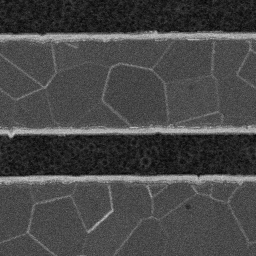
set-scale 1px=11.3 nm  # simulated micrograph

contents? one or a few lines or trenches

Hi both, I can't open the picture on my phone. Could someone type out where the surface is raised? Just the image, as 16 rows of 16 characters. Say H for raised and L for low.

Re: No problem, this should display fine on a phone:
LLLLLLLLLLLLLLLL
LLLLLLLLLLLLLLLL
HHHHHHHHHHHHHHHH
HHHHHHHHHHHHHHHH
HHHHHHHHHHHHHHHH
HHHHHHHHHHHHHHHH
HHHHHHHHHHHHHHHH
HHHHHHHHHHHHHHHH
LLLLLLLLLLLLLLLL
LLLLLLLLLLLLLLLL
LLLLLLLLLLLLLLLL
HHHHHHHHHHHHHHHH
HHHHHHHHHHHHHHHH
HHHHHHHHHHHHHHHH
HHHHHHHHHHHHHHHH
HHHHHHHHHHHHHHHH